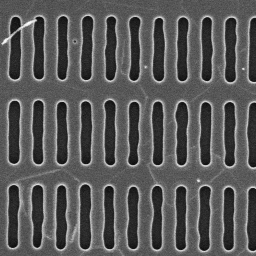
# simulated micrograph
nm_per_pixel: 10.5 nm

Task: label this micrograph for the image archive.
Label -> groups of lines, slits or small figures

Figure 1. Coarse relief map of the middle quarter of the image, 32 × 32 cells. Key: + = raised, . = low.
.+++...+++...++++..+++...+++...+
.+++...+++...+++...+++...+++...+
.+++...+++...+++...+++...+++...+
++++...+++...+++...+++...+++...+
+++++++++++++++++++++++++++++.++
++++++++++++++++++++++++++++++++
++++++++++++++++++++++++++++++++
++++++++++++++++++++++++++++++++
++++++++++++++++++++++++++++++++
+++++.++++..+++++.+++++.+++++.++
.+++...+++...+++...+++...+++...+
.+++...+++...+++...+++...+++...+
.+++...+++...+++...+++...+++...+
.+++...+++...+++...+++...+++...+
.+++...+++...+++...+++...+++...+
.+++...+++...+++...+++...+++...+
.+++...+++...+++...+++...+++...+
.+++...+++...+++...+++...+++...+
.+++...+++...+++...+++...+++...+
.+++...+++...+++...+++...+++...+
.+++...+++...+++...+++...+++...+
.+++...+++...+++...+++...+++...+
.+++...+++...+++...+++...+++...+
.+++...+++...+++...+++...+++...+
.+++...+++...+++...+++...+++...+
++++++++++++++++++++++++++++++++
++++++++++++++++++++++++++++++++
++++++++++++++++++++++++++++++++
++++++++++++++++++++++++++++++++
++++++++++++++++++++++++++++++++
++++..++++++++++++++++++++++++++
.+++...+++...+++...+++...+++...+